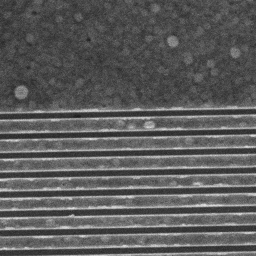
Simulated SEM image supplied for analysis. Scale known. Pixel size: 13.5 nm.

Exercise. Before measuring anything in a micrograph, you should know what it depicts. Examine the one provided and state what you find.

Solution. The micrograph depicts parallel lines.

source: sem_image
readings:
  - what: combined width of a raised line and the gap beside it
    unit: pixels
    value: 19.4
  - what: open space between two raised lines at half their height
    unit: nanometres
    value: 94.2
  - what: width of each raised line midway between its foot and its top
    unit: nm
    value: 166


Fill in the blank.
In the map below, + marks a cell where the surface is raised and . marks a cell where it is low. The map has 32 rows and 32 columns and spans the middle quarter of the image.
++++++++++++++++++++++++++++++++
++++++++++++++++++++++++++++++++
++++++++++++++++++++++++++++++++
++++++++++++++++++++++++++++++++
++++++++++++++++++++++++++++++++
++++++++++++++++++++++++++++++++
++++++++++++++++++++++++++++++++
++++++++++++++++++++++++++++++++
++++++++++++++++++++++++++++++++
++++++++++++++++++++++++++++++++
++++++++++++++++++++++++++++++++
++++++++++++++++++++++..........
................................
......................++++++++++
++++++++++++++++++++++++++++++++
++++++++++++++++++++++++++++++++
+++++++++++++++.................
................................
...............+++++++++++++++++
++++++++++++++++++++++++++++++++
++++++++++++++++++++++++++++++++
++++++++........................
................................
........++++++++++++++++++++++++
++++++++++++++++++++++++++++++++
++++++++++++++++++++++++++++++++
................................
................................
++++++++++++++++++++++++++++++++
++++++++++++++++++++++++++++++++
++++++++++++++++++++++++++++++++
................................